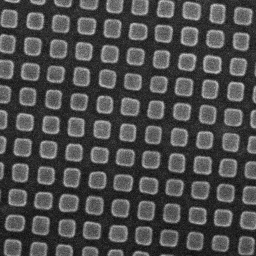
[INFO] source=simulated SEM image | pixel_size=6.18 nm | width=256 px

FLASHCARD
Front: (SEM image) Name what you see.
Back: a regular array of raised bodies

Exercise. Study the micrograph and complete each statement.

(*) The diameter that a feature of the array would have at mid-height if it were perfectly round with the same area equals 18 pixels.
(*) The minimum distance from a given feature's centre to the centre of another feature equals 155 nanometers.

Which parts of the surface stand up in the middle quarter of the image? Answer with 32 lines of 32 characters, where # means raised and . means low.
.......................###...###
...###.........................#
...###...####...................
...###...####..####...###.......
...###...####..####...####..####
..........##...####...###...####
......................###...####
............................####
..####...###....................
..####..####...####...##........
..####..####...####..####...###.
........####..####...####...###.
................##...####...###.
.......................#....###.
.####...##......................
.####...###...####..............
.####...###...####...###...###..
..###...###...####...###...####.
.........##...####...###...####.
.....................###...###..
.###............................
.####..####...##................
.###...####..####...####........
.###...####..####...####..####..
........##...####...####..####..
....................###...####..
.##........................###..
####...###......................
####...###...####...............
####..####...####..####...###...
.##...####...####..####...####..
..............##...####...####..